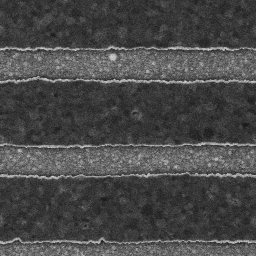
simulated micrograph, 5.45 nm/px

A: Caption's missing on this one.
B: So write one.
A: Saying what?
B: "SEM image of one or a few lines or trenches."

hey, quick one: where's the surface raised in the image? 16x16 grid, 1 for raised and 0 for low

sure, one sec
1111111111111111
1111111111111111
1111111111111111
0000000000000000
0000000000000000
1111111111111111
1111111111111111
1111111111111111
1111111111111111
0000000000000000
0000000000000000
1111111111111111
1111111111111111
1111111111111111
1111111111111111
0000000000000000